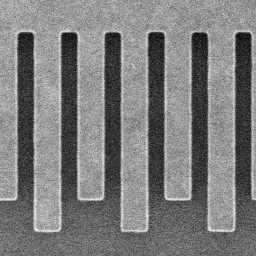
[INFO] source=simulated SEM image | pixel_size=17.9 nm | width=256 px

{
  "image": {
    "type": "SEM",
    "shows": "groups of lines, slits or small figures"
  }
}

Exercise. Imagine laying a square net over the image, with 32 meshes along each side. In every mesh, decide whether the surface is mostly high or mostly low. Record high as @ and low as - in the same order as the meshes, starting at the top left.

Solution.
@@@@@@@@@@@@@@@@@@@@@@@@@@@@@@@@
@@@@@@@@@@@@@@@@@@@@@@@@@@@@@@@@
@@@@@@@@@@@@@@@@@@@@@@@@@@@@@@@@
@@@@@@@@@@@@@@@@@@@@@@@@@@@@@@@@
@@--@@@@--@@@--@@@@--@@@--@@@--@
@@--@@@@--@@@--@@@---@@@--@@@---
@@--@@@@--@@@--@@@---@@@--@@@---
@@--@@@@--@@@--@@@---@@@--@@@---
@@--@@@@--@@@--@@@---@@@--@@@---
@@--@@@@--@@@--@@@---@@@--@@@---
@@--@@@@--@@@--@@@---@@@--@@@---
@@--@@@@--@@@--@@@---@@@--@@@---
@@--@@@@--@@@--@@@---@@@--@@@---
@@--@@@@--@@@--@@@---@@@--@@@---
@@--@@@@--@@@--@@@---@@@--@@@---
@@--@@@@--@@@--@@@---@@@--@@@---
@@--@@@@--@@@--@@@---@@@--@@@---
@@--@@@@--@@@--@@@---@@@--@@@---
@@--@@@@--@@@--@@@---@@@--@@@---
@@--@@@@--@@@--@@@---@@@--@@@---
@@--@@@@--@@@--@@@---@@@--@@@---
@@--@@@@--@@@--@@@---@@@--@@@---
@@--@@@@--@@@--@@@---@@@--@@@---
@@--@@@@--@@@--@@@---@@@--@@@---
@@--@@@@--@@@--@@@---@@@--@@@---
----@@@@-------@@@--------@@@---
----@@@@-------@@@--------@@@---
----@@@@-------@@@--------@@@---
----@@@@-------@@@--------@@@---
--------------------------------
--------------------------------
--------------------------------